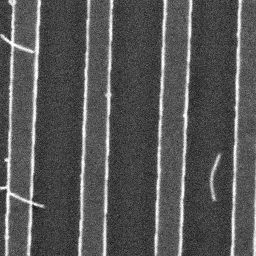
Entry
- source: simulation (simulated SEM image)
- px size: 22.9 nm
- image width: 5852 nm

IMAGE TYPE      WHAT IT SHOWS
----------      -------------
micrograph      lines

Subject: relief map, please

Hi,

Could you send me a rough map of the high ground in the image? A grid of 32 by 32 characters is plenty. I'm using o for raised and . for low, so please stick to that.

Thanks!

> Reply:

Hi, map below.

.oooo......ooo.......ooo......oo
..ooo......ooo.......ooo......oo
..ooo......ooo......oooo......oo
..ooo......ooo......oooo......oo
..ooo......ooo......oooo......oo
.oooo......ooo......oooo......oo
..ooo......ooo......oooo......oo
.oooo......ooo......oooo......oo
.oooo......ooo......oooo......oo
.oooo......ooo......oooo......oo
.oooo......ooo......oooo......oo
.oooo......ooo......ooo.......oo
.ooo.......ooo......ooo.......oo
.ooo.......ooo......ooo......ooo
.ooo.......ooo......ooo......ooo
.ooo......oooo......ooo......ooo
.ooo......oooo......ooo......ooo
.ooo......oooo......ooo......ooo
.ooo......oooo......ooo......ooo
.ooo......oooo......ooo......ooo
.ooo......ooo.......ooo......ooo
.ooo......ooo.......ooo......ooo
.ooo......ooo.......ooo......ooo
.ooo......ooo.......ooo......ooo
.ooo......ooo.......ooo......ooo
.ooo......ooo.......ooo......ooo
.ooo......ooo.......ooo......ooo
.ooo......ooo.......ooo......ooo
.ooo......ooo.......ooo......ooo
.ooo......ooo......oooo......ooo
.ooo......ooo......oooo......ooo
.ooo......ooo......oooo......ooo